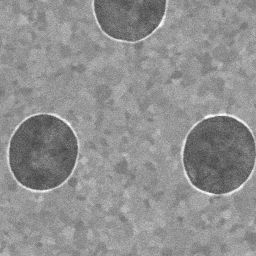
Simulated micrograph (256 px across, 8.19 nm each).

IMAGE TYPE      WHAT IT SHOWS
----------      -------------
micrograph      holes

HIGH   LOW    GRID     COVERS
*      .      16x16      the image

******....******
******....******
*******..*******
****************
****************
****************
****************
**..*********..*
*....*******....
*....******.....
*....*******....
*...********...*
****************
****************
****************
****************